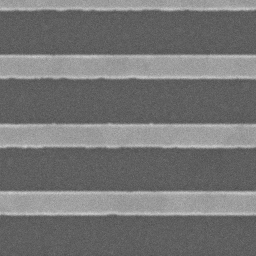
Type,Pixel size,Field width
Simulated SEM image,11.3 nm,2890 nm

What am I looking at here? lines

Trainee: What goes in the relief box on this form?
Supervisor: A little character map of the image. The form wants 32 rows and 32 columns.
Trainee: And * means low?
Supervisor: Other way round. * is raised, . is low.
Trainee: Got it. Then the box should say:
********************************
................................
................................
................................
................................
................................
................................
********************************
********************************
********************************
................................
................................
................................
................................
................................
................................
********************************
********************************
................................
................................
................................
................................
................................
................................
********************************
********************************
********************************
................................
................................
................................
................................
................................